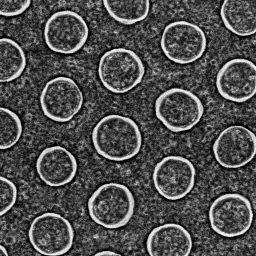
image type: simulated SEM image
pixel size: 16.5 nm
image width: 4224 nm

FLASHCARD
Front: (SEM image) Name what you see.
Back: a regular array of raised bodies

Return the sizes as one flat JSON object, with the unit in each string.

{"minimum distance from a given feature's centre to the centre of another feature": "1110 nm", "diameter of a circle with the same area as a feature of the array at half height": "671 nanometres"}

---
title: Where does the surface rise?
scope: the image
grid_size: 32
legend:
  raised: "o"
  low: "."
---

ooo..........ooooo..........oooo
oo............oooo..........oooo
......oooo.....oo...........oooo
......ooooo..........oooo....ooo
......ooooo.........ooooo.......
oo....oooo..........ooooo.......
ooo...........oo.....oooo.......
ooo..........oooo.....oo........
ooo.........oooooo..........oooo
oo...........ooooo.........ooooo
......ooo....oooo..........ooooo
......oooo...........oo.....oooo
.....ooooo..........ooooo.......
......oooo..........ooooo.......
oo....ooo...........ooooo.......
oo..........ooooo....ooo........
oo..........ooooo...........ooo.
oo..........ooooo..........ooooo
.......o....ooooo..........ooooo
.....oooo....ooo...........ooooo
.....oooo...........oooo....oo..
.....oooo..........ooooo........
o.....ooo..........ooooo........
oo...........oo.....oooo........
oo..........oooo.....oo.........
oo.........ooooo...........oooo.
...........ooooo..........ooooo.
.....ooo....oooo..........ooooo.
....ooooo...........ooo....oooo.
....ooooo..........ooooo........
....ooooo..........ooooo........
o....ooo...........ooooo........